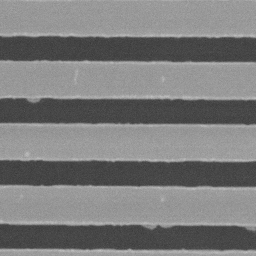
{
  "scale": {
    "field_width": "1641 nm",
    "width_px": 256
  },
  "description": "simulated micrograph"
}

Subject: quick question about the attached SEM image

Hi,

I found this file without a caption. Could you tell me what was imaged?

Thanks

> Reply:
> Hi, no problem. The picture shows lines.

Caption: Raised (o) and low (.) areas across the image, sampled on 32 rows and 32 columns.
oooooooooooooooooooooooooooooooo
oooooooooooooooooooooooooooooooo
oooooooooooooooooooooooooooooooo
oooooooooooooooooooooooooooooooo
oo.oo..ooooooooooooooooooooooooo
................................
................................
................................
oooooooooooooooooooooooooooooooo
oooooooooooooooooooooooooooooooo
oooooooooooooooooooooooooooooooo
oooooooooooooooooooooooooooooooo
................................
................................
................................
ooooo.....o.....................
oooooooooooooooooooooooooooooooo
oooooooooooooooooooooooooooooooo
oooooooooooooooooooooooooooooooo
oooooooooooooooooooooooooooooooo
................................
................................
................................
oooooooooooooooooooooooooooooooo
oooooooooooooooooooooooooooooooo
oooooooooooooooooooooooooooooooo
oooooooooooooooooooooooooooooooo
oooooooooooooooooooooooooooooooo
................................
................................
................................
oooooooooooooooooooooooooooooooo